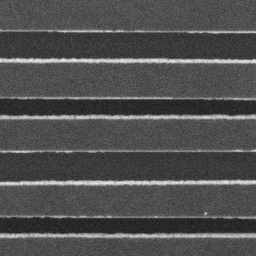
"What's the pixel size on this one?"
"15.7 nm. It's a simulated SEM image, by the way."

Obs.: lines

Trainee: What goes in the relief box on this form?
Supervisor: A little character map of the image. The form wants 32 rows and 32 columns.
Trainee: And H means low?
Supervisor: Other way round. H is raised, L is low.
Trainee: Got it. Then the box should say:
HHHHHHHHHHHHHHHHHHHHHHHHHHHHHHHH
HHHHHHHHHHHHHHHHHHHHHHHHHHHHHHHH
HHHHHHHHHHHHHHHHHHHHHHHHHHHHHHHH
HHHHHHHHHHHHHHHHHHHHHHHHHHHHHHHH
LLLLLLLLLLLLLLLLLLLLLLLLLLLLLLLL
LLLLLLLLLLLLLLLLLLLLLLLLLLLLLLLL
LLLLLLLLLLLLLLLLLLLLLLLLLLLLLLLL
LLLLLLLLLLLLLLLLLLLLLLLLLLLLLLLL
HHHHHHHHHHHHHHHHHHHHHHHHHHHHHHHH
HHHHHHHHHHHHHHHHHHHHHHHHHHHHHHHH
HHHHHHHHHHHHHHHHHHHHHHHHHHHHHHHH
HHHHHHHHHHHHHHHHHHHHHHHHHHHHHHHH
LLLLLLLLLLLLLLLLLLLLLLLLLLLLLLLL
LLLLLLLLLLLLLLLLLLLLLLLLLLLLLLLL
LLLLLLLLLLLLLLLLLLLLLLLLLLLLLLLL
HHHHHHHHHHHHHHHHHHHHHHHHHHHHHHHH
HHHHHHHHHHHHHHHHHHHHHHHHHHHHHHHH
HHHHHHHHHHHHHHHHHHHHHHHHHHHHHHHH
HHHHHHHHHHHHHHHHHHHHHHHHHHHHHHHH
LLLLLLLLLLLLLLLLLLLLLLLLLLLLLLLL
LLLLLLLLLLLLLLLLLLLLLLLLLLLLLLLL
LLLLLLLLLLLLLLLLLLLLLLLLLLLLLLLL
LLLLLLLLLLLLLLLLLLLLLLLLLLLLLLLL
HHHHHHHHHHHHHHHHHHHHHHHHHHHHHHHH
HHHHHHHHHHHHHHHHHHHHHHHHHHHHHHHH
HHHHHHHHHHHHHHHHHHHHHHHHHHHHHHHH
HHHHHHHHHHHHHHHHHHHHHHHHHHHHHHHH
LLLLLLLLLLLLLLLLLLLLLLLLLLLLLLLL
LLLLLLLLLLLLLLLLLLLLLLLLLLLLLLLL
HHHHHHHHHHHHHHHHHHHHHHHHHHHHHHHH
HHHHHHHHHHHHHHHHHHHHHHHHHHHHHHHH
HHHHHHHHHHHHHHHHHHHHHHHHHHHHHHHH